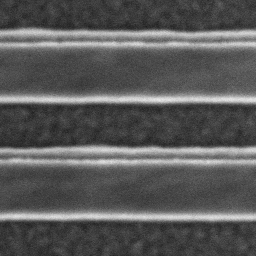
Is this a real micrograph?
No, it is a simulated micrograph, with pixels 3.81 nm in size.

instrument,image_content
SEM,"lines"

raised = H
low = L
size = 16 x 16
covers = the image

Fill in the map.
LLLLLLLLLLLLLLLL
LLLLLLLLLLLLLLLL
HHHHHHHHHHHHHHHH
HHHHHHHHHHHHHHHH
HHHHHHHHHHHHHHHH
HHHHHHHHHHHHHHHH
LLLLLLLLLLLLLLLL
LLLLLLLLLLLLLLLL
LLLLLLLLLLLLLLLL
HHHHHHHHHHHHHHHH
HHHHHHHHHHHHHHHH
HHHHHHHHHHHHHHHH
HHHHHHHHHHHHHHHH
HHHHHHHHHHHHHHHH
LLLLLLLLLLLLLLLL
LLLLLLLLLLLLLLLL